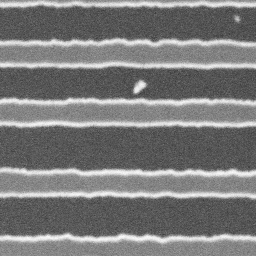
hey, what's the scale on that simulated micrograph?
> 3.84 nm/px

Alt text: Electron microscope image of lines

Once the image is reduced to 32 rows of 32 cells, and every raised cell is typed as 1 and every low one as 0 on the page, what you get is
11111111111111111111111111111111
00000000000000000000000000000000
00000000000000000000000000000000
00000000000000000000000000000000
00000000000000000000000000000000
11111111111111111111111111111111
11111111111111111111111111111111
11111111111111111111111111111111
00000000000000000000000000000000
00000000000000000000000000000000
00000000000000000000000000000000
00000000000000000000000000000000
11000000111100010100000011010000
11111111111111111111111111111111
11111111111111111111111111111111
11111111111111111111111111111111
00000000000000000000000000000000
00000000000000000000000000000000
00000000000000000000000000000000
00000000000000000000000000000000
00000000000000000000000000000000
11111111110011111100110110001100
11111111111111111111111111111111
11111111111111111111111111111111
00000000000000000000001000011001
00000000000000000000000000000000
00000000000000000000000000000000
00000000000000000000000000000000
00000000000000000000000000000000
00000000100000010000000000000000
11111111111111111111111111111111
11111111111111111111111111111111